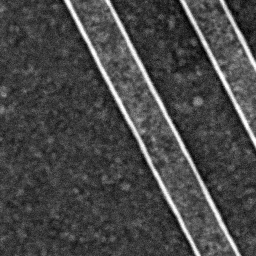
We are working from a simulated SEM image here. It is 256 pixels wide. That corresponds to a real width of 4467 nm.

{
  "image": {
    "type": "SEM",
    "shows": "one or a few lines or trenches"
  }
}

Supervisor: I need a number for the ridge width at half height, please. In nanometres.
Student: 611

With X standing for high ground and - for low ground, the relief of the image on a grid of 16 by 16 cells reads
----XXX-----XX--
-----XX-----XXX-
-----XXX-----XX-
------XX-----XXX
------XXX-----XX
-------XX-----XX
--------XX-----X
--------XXX----X
---------XX-----
---------XXX----
----------XX----
----------XXX---
-----------XX---
-----------XXX--
------------XX--
------------XXX-